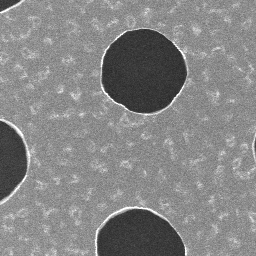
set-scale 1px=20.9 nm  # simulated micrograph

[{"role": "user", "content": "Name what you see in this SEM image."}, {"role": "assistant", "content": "holes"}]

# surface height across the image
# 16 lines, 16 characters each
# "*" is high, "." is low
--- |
.***************
****************
*******....*****
*******....*****
******......****
******.....*****
*******....*****
****************
.***************
..**************
..**************
.***************
****************
*******...******
******.....*****
******......****